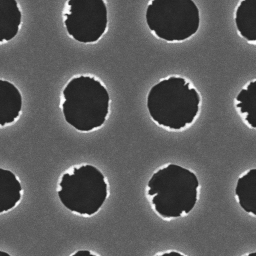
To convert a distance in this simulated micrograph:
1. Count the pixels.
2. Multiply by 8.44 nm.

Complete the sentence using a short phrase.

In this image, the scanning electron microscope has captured holes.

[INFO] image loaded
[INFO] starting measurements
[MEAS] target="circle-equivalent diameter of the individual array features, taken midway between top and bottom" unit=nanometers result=425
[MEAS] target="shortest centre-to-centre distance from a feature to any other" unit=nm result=736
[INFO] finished